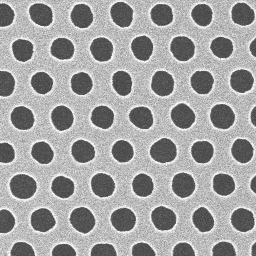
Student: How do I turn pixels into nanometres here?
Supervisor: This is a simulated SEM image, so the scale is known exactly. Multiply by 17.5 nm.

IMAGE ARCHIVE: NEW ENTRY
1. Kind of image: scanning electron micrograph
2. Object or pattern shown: a regular array of holes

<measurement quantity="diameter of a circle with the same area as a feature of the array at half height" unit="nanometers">417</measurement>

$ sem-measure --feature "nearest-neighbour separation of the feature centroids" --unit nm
679